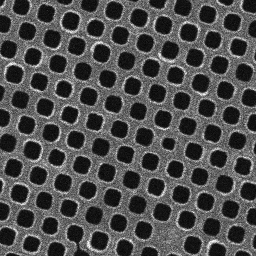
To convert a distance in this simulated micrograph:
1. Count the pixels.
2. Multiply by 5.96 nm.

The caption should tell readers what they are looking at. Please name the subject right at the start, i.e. a regular array of holes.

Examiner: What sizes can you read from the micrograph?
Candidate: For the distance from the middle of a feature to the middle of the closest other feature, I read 153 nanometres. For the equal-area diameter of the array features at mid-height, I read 104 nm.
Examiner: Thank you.